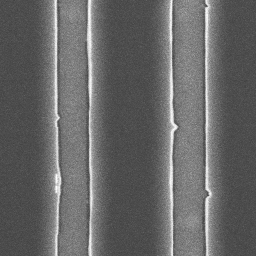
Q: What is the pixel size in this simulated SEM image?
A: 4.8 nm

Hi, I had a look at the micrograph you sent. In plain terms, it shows one or a few lines or trenches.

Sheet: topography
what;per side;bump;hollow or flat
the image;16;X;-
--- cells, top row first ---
XXX---XXXXX--XXX
XXXX--XXXXX--XXX
XXXX--XXXXX--XXX
XXX---XXXXX--XXX
XXX---XXXXX--XXX
XXX---XXXXX--XXX
XXX---XXXXX--XXX
XXXX--XXXXX--XXX
XXXX--XXXXX--XXX
XXXX--XXXXX--XXX
XXXX--XXXXX--XXX
XXXX--XXXXX--XXX
XXXX--XXXXX--XXX
XXXX--XXXXX--XXX
XXXX--XXXXX--XXX
XXXX--XXXXX--XXX